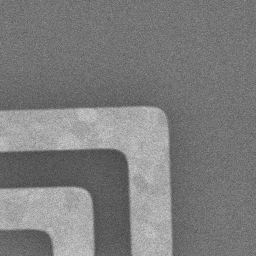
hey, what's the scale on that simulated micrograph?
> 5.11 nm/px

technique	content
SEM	groups of lines, slits or small figures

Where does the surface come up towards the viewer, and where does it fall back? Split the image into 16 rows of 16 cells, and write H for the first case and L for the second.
LLLLLLLLLLLLLLLL
LLLLLLLLLLLLLLLL
LLLLLLLLLLLLLLLL
LLLLLLLLLLLLLLLL
LLLLLLLLLLLLLLLL
LLLLLLLLLLLLLLLL
LLLLLLLLLLLLLLLL
HHHHHHHHHHLLLLLL
HHHHHHHHHHHLLLLL
LLLLLLLLHHHLLLLL
LLLLLLLLHHHLLLLL
LLLLLLLLHHHLLLLL
HHHHHHLLHHHLLLLL
HHHHHHLLHHHLLLLL
LLLHHHLLHHHLLLLL
LLLHHHLLHHHLLLLL